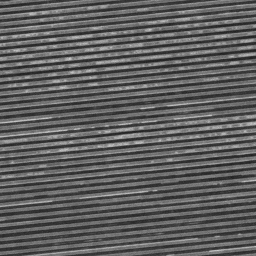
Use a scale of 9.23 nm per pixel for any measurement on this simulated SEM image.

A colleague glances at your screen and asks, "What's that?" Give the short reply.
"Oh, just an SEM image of parallel lines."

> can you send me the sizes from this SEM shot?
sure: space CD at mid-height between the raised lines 35.6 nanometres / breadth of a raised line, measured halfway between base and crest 28.7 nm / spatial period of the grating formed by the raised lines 63.7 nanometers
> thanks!